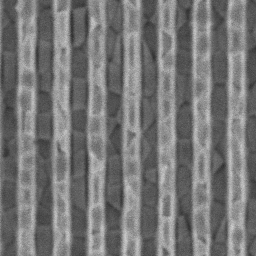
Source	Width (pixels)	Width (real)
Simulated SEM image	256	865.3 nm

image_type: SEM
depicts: parallel lines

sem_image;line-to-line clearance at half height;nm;62.4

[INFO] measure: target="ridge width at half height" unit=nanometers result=53.6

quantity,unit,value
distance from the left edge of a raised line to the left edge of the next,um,0.118